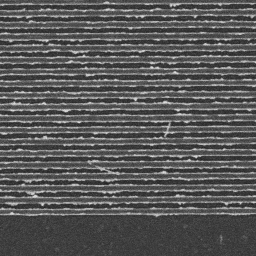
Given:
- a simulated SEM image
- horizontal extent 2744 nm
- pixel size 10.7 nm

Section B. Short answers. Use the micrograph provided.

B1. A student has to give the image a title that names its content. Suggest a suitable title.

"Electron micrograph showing parallel lines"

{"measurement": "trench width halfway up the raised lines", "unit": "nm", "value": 48.2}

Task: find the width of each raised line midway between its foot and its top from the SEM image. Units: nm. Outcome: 71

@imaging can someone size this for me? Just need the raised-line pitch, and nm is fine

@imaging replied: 125